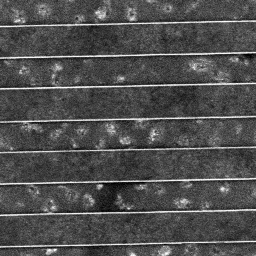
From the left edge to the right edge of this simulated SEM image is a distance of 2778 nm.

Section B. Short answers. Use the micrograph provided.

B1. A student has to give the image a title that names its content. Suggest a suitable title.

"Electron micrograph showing one or a few lines or trenches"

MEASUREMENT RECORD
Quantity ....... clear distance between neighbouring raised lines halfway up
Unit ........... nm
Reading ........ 332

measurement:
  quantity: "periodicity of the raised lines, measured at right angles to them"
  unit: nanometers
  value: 683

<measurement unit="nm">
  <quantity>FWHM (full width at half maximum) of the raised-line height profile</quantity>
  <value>348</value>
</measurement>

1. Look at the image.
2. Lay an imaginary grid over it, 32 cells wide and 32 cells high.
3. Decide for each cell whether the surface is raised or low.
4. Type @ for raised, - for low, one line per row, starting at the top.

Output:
--------------------------------
--------------------------------
--------------------------------
@@@@@@@@@@@@@@@@@@@@@@@@@@@@@@@@
@@@@@@@@@@@@@@@@@@@@@@@@@@@@@@@@
@@@@@@@@@@@@@@@@@@@@@@@@@@@@@@@@
@@@@@@@@@@@@@@@@@@@@@@@@@@@@@@@@
--------------------------------
--------------------------------
--------------------------------
----------------------------@@@@
@@@@@@@@@@@@@@@@@@@@@@@@@@@@@@@@
@@@@@@@@@@@@@@@@@@@@@@@@@@@@@@@@
@@@@@@@@@@@@@@@@@@@@@@@@@@@@@@@@
@@@@@@@@@@@@@@@@@@@@@@@@@@@@@@@@
--------------------------------
--------------------------------
--------------------------------
------------------------------@@
@@@@@@@@@@@@@@@@@@@@@@@@@@@@@@@@
@@@@@@@@@@@@@@@@@@@@@@@@@@@@@@@@
@@@@@@@@@@@@@@@@@@@@@@@@@@@@@@@@
@@@@@@@@@@@@@@@@@@@@@@@---------
--------------------------------
--------------------------------
--------------------------------
--------------------@@@@@@@@@@@@
@@@@@@@@@@@@@@@@@@@@@@@@@@@@@@@@
@@@@@@@@@@@@@@@@@@@@@@@@@@@@@@@@
@@@@@@@@@@@@@@@@@@@@@@@@@@@@@@@@
@@@@@@@@@@@@@@@@@---------------
--------------------------------